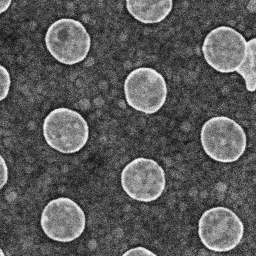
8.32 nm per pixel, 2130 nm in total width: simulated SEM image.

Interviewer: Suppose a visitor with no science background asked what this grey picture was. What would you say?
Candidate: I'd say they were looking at raised bodies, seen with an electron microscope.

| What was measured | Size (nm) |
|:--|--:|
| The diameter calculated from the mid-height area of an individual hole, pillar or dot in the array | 356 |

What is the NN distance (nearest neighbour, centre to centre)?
745 nm